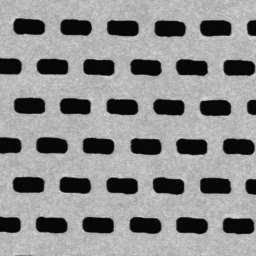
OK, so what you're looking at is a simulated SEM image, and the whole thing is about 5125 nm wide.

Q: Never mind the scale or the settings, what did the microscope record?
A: a regular array of holes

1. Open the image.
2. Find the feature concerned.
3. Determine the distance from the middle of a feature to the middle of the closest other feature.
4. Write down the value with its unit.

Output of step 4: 909 nm